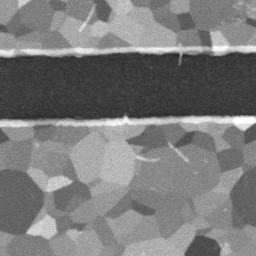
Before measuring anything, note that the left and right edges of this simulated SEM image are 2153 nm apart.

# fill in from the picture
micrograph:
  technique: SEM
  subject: one or a few lines or trenches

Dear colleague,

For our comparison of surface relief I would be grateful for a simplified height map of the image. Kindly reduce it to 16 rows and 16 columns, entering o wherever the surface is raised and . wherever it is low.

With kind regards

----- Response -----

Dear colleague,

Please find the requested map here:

oooooooooooooooo
oooooooooooooooo
oooooooooooooooo
................
................
................
................
................
oooooooooooooooo
oooooooooooooooo
oooooooooooooooo
oooooooooooooooo
oooooooooooooooo
oooooooooooooooo
oooooooooooooooo
oooooooooooooooo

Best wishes